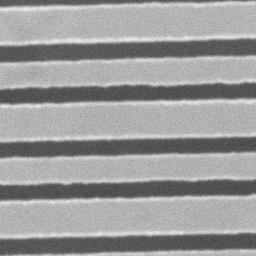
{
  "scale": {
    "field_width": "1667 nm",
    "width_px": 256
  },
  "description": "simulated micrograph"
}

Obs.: lines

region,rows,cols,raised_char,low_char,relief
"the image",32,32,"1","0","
00000000000000000011011111111111
11111111111111111111111111111111
11111111111111111111111111111111
11111111111111111111111111111111
11111111111111111111111111111111
11111100000000000000000000000000
00000000000000000000000000000000
00000000000000011111111111111111
11111111111111111111111111111111
11111111111111111111111111111111
11111111111111101011110000000000
00000000000000000000000000000000
00000000000000000000000101111111
11111111111111111111111111111111
11111111111111111111111111111111
11111111111111111111111111111111
11111111111111111111111111111111
11111011000000000000000000000000
00000000000000000000000000000000
00000000000000011111111111111111
11111111111111111111111111111111
11111111111111111111111111111111
11111111111111111110000110000000
00000000000000000000000000000000
00000000000000000000000000000001
11111111111111111111111111111111
11111111111111111111111111111111
11111111111111111111111111111111
11111111111111111111111111111111
11111111111111100000000000000000
00000000000000000000000000000000
00000000000000000000011111111111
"